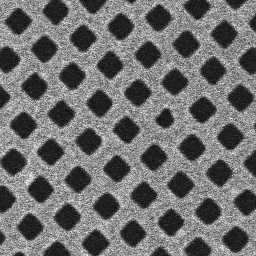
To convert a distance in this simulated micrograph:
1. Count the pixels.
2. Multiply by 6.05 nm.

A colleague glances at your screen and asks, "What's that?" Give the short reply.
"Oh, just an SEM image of a regular array of holes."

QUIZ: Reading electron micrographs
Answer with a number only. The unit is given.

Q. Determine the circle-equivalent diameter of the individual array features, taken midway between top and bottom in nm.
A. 147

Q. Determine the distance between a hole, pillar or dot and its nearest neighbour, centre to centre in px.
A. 38.2